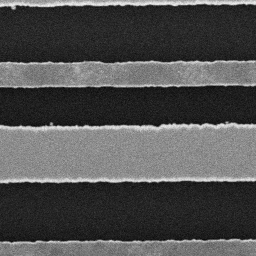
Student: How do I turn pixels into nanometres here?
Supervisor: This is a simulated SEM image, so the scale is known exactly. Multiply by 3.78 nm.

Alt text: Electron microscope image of lines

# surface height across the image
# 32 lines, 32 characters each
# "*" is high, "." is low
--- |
*************************.****.*
................................
................................
................................
................................
................................
................................
................................
********************************
********************************
********************************
................................
................................
................................
................................
.............................*..
********************************
********************************
********************************
********************************
********************************
********************************
********************************
................................
................................
................................
................................
................................
................................
................................
********************************
********************************